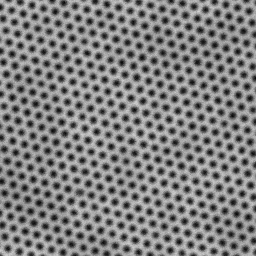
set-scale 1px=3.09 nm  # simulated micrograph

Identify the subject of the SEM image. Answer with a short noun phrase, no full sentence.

a regular array of holes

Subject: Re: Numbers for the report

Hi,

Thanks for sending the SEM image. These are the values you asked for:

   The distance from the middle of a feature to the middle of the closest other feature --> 36.4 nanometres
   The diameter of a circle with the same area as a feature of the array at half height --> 22.1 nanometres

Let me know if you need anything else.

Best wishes